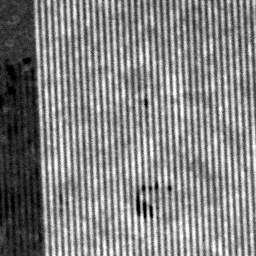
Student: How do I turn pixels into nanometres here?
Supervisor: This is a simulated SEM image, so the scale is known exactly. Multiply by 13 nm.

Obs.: parallel lines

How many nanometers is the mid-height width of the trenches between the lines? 55.2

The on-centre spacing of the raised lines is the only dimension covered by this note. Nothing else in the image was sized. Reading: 83.4 nanometers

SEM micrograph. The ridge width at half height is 0.0244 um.